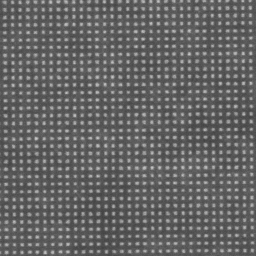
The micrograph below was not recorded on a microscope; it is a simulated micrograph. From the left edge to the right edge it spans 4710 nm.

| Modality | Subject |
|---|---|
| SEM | a regular array of raised bodies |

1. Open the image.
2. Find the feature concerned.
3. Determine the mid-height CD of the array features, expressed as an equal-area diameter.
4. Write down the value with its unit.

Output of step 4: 3.19 pixels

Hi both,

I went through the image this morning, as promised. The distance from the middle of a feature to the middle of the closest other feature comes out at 138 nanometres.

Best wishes